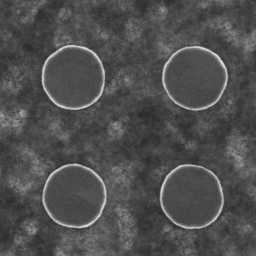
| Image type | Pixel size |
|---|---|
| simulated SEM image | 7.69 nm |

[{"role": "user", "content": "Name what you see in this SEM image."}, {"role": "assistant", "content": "raised bodies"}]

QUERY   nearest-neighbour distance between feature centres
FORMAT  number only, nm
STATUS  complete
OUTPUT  907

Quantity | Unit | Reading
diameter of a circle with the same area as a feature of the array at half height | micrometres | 0.483